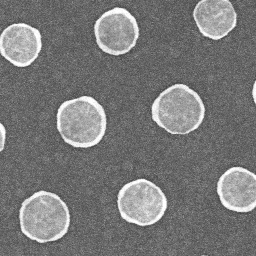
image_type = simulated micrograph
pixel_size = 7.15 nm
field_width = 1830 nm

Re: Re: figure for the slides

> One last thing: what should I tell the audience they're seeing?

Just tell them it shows raised bodies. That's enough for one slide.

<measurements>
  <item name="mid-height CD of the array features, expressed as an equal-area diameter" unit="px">47.2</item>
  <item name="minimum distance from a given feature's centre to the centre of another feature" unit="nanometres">702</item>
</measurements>